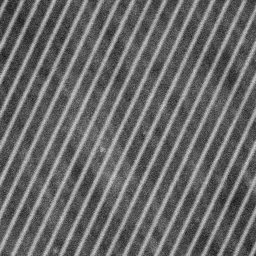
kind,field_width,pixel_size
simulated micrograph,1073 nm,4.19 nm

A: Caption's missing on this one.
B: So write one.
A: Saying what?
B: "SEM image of parallel lines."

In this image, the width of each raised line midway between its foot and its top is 8.6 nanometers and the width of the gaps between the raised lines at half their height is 0.0502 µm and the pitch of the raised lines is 0.0601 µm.